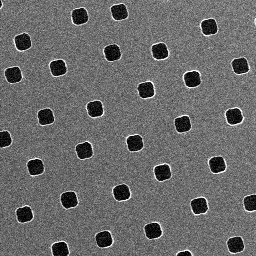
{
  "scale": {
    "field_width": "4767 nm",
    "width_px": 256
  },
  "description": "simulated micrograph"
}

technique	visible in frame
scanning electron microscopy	a regular array of holes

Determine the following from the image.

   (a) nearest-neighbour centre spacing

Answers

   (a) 836 nm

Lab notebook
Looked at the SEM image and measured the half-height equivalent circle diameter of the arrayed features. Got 321 nanometers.